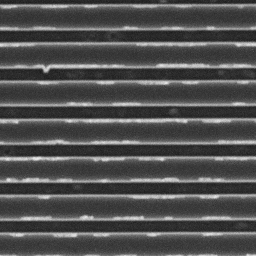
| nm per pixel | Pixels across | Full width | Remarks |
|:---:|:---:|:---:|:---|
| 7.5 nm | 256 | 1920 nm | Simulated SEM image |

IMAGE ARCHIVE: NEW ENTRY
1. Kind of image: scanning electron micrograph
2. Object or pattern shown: parallel lines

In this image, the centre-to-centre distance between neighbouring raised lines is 38.1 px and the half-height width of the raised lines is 185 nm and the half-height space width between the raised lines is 102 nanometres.